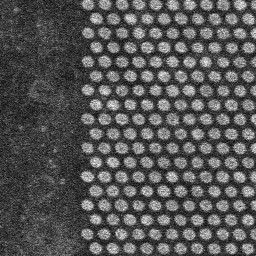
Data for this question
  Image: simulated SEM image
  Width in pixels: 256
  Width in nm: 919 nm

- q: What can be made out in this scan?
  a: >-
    a regular array of raised bodies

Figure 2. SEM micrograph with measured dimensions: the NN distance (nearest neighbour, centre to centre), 58.3 nanometres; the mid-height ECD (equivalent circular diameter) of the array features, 39.1 nanometres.